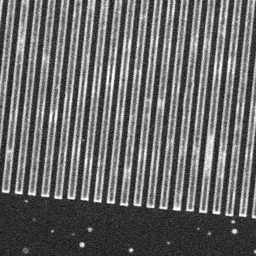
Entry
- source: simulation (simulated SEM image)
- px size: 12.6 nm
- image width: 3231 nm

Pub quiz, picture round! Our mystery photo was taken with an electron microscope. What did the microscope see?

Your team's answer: parallel lines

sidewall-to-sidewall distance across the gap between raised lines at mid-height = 84.7 nanometres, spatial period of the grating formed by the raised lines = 166 nm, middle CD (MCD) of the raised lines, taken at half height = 86.3 nm